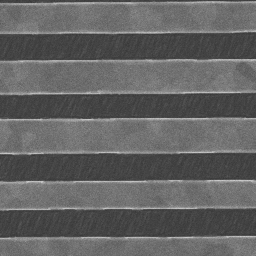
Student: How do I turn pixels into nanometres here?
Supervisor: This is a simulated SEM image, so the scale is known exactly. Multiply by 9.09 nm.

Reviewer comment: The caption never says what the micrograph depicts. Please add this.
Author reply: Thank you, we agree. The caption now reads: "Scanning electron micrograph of wiring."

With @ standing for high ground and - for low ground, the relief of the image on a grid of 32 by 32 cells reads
@---@@@@@@@@@@@@@@@@@@@@@@@@@@@@
@@@@@@@@@@@@@@@@@@@@@@@@@@@@@@@@
@@@@@@@@@@@@@@@@@@@@@@@@@@@@@@@@
@@@@@@@@@@@@@@@@@@@@@@@@@@@@@@@@
--------------------------------
--------------------------------
--------------------------------
--------------------------------
@@@@@@@@@@@@@@@@@@@@@@@@@@@@@@@@
@@@@@@@@@@@@@@@@@@@@@@@@@@@@@@@@
@@@@@@@@@@@@@@@@@@@@@@@@@@@@@@@@
@@@@@@@@@@@@@@@@@@@@@@@@@@@@@@@@
--------------------------------
--------------------------------
--------------------------------
@@@@@@@@@@@@@@@@@@@@@@@@@@@@@@@@
@@@@@@@@@@@@@@@@@@@@@@@@@@@@@@@@
@@@@@@@@@@@@@@@@@@@@@@@@@@@@@@@@
@@@@@@@@@@@@@@@@@@@@@@@@@@@@@@@@
--------------------------------
--------------------------------
--------------------------------
--------------------------------
@@@@@@@@@@@@@@@@@@@@@@@@@@@@@@@@
@@@@@@@@@@@@@@@@@@@@@@@@@@@@@@@@
@@@@@@@@@@@@@@@@@@@@@@@@@@@@@@@@
--------------------------------
--------------------------------
--------------------------------
--------------------------------
@@@@@@@@@@@@@@@@@@@@@@@@@@@@@@@@
@@@@@@@@@@@@@@@@@@@@@@@@@@@@@@@@